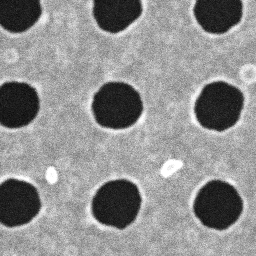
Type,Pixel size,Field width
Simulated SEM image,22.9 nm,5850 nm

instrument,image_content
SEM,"holes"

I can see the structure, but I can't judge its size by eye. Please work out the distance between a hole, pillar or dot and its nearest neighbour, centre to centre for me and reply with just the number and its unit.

2.25 microns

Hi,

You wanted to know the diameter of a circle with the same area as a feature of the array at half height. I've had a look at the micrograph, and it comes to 1170 nm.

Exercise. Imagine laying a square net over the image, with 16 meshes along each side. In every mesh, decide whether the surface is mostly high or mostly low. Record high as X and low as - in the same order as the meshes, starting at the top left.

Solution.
---XXX---XXX---X
--XXXX--XXXX---X
XXXXXXXXXXXXXXXX
XXXXXXXXXXXXXXXX
XXXXXXXXXXXXXXXX
--XXXX--XXXXX--X
--XXXX---XXX---X
--XXXX---XXX---X
XXXXXXXXXXXXXXXX
XXXXXXXXXXXXXXXX
XXXXXXXXXXXXXXXX
--XXXX--XXXXX-XX
---XXX---XXX---X
--XXXX---XXX---X
XXXXXXXXXXXXXXXX
XXXXXXXXXXXXXXXX